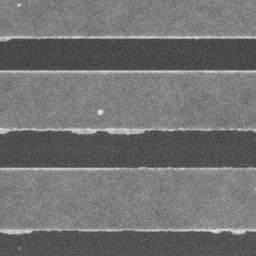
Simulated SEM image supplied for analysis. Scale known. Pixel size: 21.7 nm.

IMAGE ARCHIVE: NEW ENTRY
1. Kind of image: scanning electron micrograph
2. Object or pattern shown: lines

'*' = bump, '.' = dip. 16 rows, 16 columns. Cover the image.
****************
****************
................
................
****************
****************
****************
****************
................
................
........*.......
****************
****************
****************
................
................